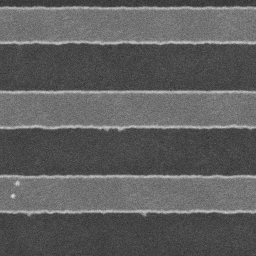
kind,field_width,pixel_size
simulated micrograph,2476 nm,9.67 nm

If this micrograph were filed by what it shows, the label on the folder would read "lines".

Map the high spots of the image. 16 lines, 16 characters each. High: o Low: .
oooooooooooooooo
oooooooooooooooo
oooooooooooooooo
................
................
................
oooooooooooooooo
oooooooooooooooo
................
................
................
oooooooooooooooo
oooooooooooooooo
................
................
................